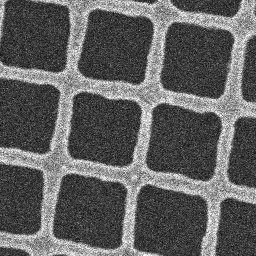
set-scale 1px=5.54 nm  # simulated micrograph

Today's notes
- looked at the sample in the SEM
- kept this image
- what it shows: holes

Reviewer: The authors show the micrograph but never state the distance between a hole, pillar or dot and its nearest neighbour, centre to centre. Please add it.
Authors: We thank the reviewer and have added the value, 451 nm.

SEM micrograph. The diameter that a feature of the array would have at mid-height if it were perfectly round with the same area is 425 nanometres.